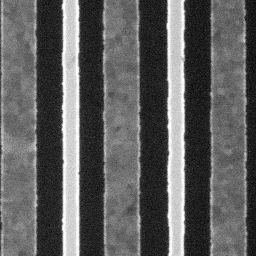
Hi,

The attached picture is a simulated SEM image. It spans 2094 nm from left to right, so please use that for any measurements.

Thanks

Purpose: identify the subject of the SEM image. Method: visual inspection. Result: lines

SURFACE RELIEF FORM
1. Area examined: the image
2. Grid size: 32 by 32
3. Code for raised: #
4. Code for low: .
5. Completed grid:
####....##...####....##...#####.
####....##...####....##...#####.
####....##...####....##...#####.
####....##...####....##...#####.
####....##...####....##...#####.
####....##...####....##...#####.
####....##...####....##...#####.
####....##...####....##...#####.
####....##...####....##...#####.
####....##...####....##...#####.
####....##...####....##...#####.
####....##...####....##...#####.
####....##...####....##...#####.
####....##...####....##...#####.
#####...##...####....##...#####.
####....##...####....##...#####.
####....##...####....##...#####.
####....##...####....##...#####.
####....##...####....##...#####.
####....##...####....##...#####.
####....##...####....##...#####.
####....##...####....##...#####.
####....##...####....##...#####.
####....##...####....##...#####.
#####...##...####....##...#####.
#####...##...####....##...#####.
####....##...####....##...#####.
####....##...####....##...#####.
####....##...####....##...#####.
####....##...####....##...#####.
####....##...####....##...#####.
####....##...####....##...#####.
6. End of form